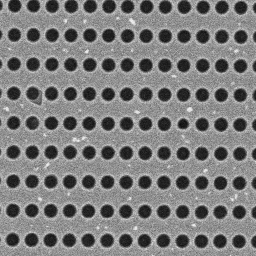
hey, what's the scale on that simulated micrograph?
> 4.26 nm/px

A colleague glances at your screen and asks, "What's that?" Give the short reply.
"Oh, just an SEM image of a regular array of holes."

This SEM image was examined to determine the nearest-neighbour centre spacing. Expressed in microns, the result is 0.0802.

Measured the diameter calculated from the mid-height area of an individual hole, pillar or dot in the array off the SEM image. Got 13.1 pixels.